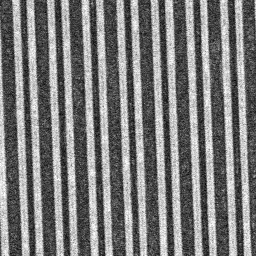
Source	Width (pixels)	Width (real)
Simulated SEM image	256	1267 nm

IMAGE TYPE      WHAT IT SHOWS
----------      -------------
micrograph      parallel lines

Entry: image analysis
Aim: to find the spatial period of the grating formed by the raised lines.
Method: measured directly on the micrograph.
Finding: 84.7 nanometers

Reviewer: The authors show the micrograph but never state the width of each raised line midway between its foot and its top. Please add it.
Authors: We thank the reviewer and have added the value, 30.3 nm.